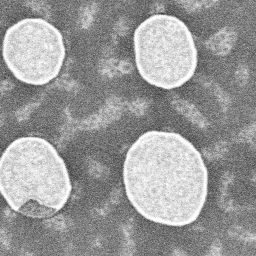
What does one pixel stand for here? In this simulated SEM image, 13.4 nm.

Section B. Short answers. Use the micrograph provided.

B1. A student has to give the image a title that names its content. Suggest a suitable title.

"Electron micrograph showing raised bodies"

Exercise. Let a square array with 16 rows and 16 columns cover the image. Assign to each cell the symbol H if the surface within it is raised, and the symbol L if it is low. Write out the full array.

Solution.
LLLLLLLLLLLLLLLL
LHHLLLLLLHHLLLLL
HHHHLLLLHHHHLLLL
HHHHLLLLLHHHLLLL
LHHHLLLLLHHHLLLL
LLLLLLLLLLLLLLLL
LLLLLLLLLLLLLLLL
LLLLLLLLLLLLLLLL
LLLLLLLLLHHLLLLL
HHHLLLLLHHHHLLLL
HHHHLLLLHHHHHLLL
HHHHLLLLHHHHHLLL
HHHHLLLLHHHHHLLL
LLLLLLLLLHHHLLLL
LLLLLLLLLLLLLLLL
LLLLLLLLLLLLLLLL